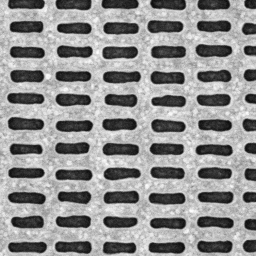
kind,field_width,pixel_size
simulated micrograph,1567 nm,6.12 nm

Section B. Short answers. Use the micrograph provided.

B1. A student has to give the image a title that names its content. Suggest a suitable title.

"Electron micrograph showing a regular array of holes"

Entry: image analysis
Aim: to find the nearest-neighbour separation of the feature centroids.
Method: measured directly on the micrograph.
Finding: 146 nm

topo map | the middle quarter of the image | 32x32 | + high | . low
++++++++++++++++++++++++++++++++
++++++++++++++++++++++++++++++++
.......+++.........+++........++
.......+++.........++.........++
...+.+++++.........+++........++
++++++++++++++++++++++++++++++++
++++++++++++++++++++++++++++++++
.....++++++......+++++++++++++++
.......+++........++++........++
.......+++........++++.........+
..++++++++++++....+++++.......++
++++++++++++++++++++++++++++++++
++++++++++++++++++++++++++++++++
+++++++++++++.++++++++++++++++++
.......+++........++++........++
.......+++........++++.........+
.......+++........++++........++
++++++++++++++++++++++++++++++++
++++++++++++++++++++++++++++++++
++++.+++++++++++++++++++++++++++
.......+++.........+++........++
......++++.........++.........++
.....+++++........++++.......+++
++++++++++++++++++++++++++++++++
++++++++++++++++++++++++++++++++
++++++++++++++++++++++....++++++
.......+++.........+++........++
.......+++..........++........++
.......+++.........+++........++
++++++++++++++++++++++++++++++++
++++++++++++++++++++++++++++++++
+++++++++++...+..+++++++++++++++